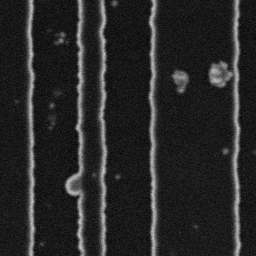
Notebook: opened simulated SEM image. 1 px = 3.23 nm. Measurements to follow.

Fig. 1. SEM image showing lines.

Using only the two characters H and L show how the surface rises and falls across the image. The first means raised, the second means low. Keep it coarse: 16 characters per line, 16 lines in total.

HHLLLHHLLLHHHHHL
HHLLLHHLLHHHHHHL
HHLLLHHLLHHHHHHL
HHLLLHHLLHHHHHHL
HHLLLHHLLHHHHHHL
HHLLLHHLLHHHHHHL
HHLLLHHLLHHHHHHL
HHLLLHLLLHHHHHHL
HHLLLHHLLHHHHHHL
HHLLLHHLLHHHHHHL
HHLLLHHLLHHHHHHL
HHLLHHHLLLHHHHHL
HHLLLHHLLHHHHHHL
HHLLLHHLLLHHHHHL
HHLLLHHLLHHHHHHL
HHLLLHHLLLHHHHHL